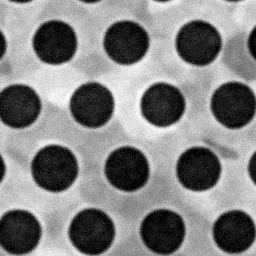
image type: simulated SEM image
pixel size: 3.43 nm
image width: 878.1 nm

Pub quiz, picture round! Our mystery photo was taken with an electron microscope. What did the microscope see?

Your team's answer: a regular array of holes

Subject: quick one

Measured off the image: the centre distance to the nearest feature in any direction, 244 nm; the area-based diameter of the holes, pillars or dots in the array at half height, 162 nanometres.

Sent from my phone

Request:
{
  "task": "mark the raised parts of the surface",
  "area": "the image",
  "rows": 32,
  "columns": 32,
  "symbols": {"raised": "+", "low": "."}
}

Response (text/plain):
++.++++++++.++++++++++++++++++++
++++++++++++++++++++++++++++++++
++++++..+++++++..+++++++.+++++++
+++++....++++.....++++.....+++++
.+++......+++......+++......+++.
.+++......+++......+++......+++.
.+++......+++.....++++......+++.
+++++....+++++....+++++....+++++
++++++++++++++++++++++++++++++++
++++++++++++++++++++++++++++++++
+..+++++++...++++++...++++++...+
.....++++.....++++.....++++.....
.....++++.....+++......+++......
.....++++.....+++......+++......
.....++++.....++++.....++++.....
....++++++...++++++...+++++....+
++++++++++++++++++++++++++++++++
++++++++++++++++++++++++++++++++
+++++....++++++..++++++...++++++
++++.....++++.....++++.....++++.
.+++......+++......+++......+++.
.+++......+++......+++......+++.
++++......+++......+++.....++++.
+++++....+++++....+++++....+++++
++++++++++++++++++++++++++++++++
++++++++++++++++++++++++++++++++
+...++++++...++++++...++++++...+
.....++++.....++++.....++++.....
.....+++......+++......++++.....
.....+++......+++......++++.....
.....++++.....++++.....++++.....
+...++++++...++++++...++++++...+